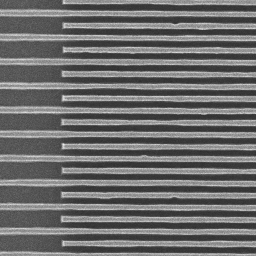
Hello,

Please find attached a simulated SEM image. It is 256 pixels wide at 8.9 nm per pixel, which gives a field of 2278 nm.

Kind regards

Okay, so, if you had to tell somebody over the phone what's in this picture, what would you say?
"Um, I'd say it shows parallel lines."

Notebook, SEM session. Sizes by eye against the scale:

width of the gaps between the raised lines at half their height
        52.3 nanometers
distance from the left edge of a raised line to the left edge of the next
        108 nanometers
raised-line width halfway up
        0.0523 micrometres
